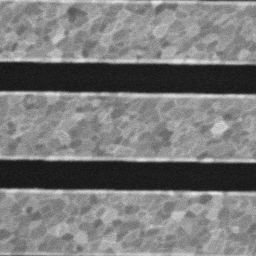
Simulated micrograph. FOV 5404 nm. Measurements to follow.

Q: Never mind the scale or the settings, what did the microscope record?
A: lines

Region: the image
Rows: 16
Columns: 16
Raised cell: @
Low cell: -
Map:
@@@@@@@@@@@@@@@@
@@@@@@@@@@@@@@@@
@@@@@@@@@@@@@@@@
@@@@@@@@@@@@@@@@
----------------
----------------
@@@@@@@@@@@@@@@@
@@@@@@@@@@@@@@@@
@@@@@@@@@@@@@@@@
@@@@@@@@@@@@@@@@
----------------
----------------
@@@@@@@@@@@@@@@@
@@@@@@@@@@@@@@@@
@@@@@@@@@@@@@@@@
@@@@@@@@@@@@@@@@